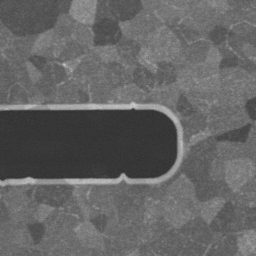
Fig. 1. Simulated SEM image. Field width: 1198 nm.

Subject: one or a few lines or trenches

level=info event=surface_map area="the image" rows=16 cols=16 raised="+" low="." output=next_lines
++++++++++++++++
++++++++++++++++
++++++++++++++++
++++++++++++++++
++++++++++++++++
++++++++++++++++
++++++++++++++++
...........+++++
...........+++++
...........+++++
...........+++++
++++++++++++++++
++++++++++++++++
++++++++++++++++
++++++++++++++++
++++++++++++++++